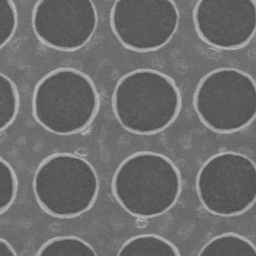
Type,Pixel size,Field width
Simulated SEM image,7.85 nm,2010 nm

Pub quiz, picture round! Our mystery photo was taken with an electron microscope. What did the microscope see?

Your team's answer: holes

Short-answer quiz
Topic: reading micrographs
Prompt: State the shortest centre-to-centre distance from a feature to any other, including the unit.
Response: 634 nanometers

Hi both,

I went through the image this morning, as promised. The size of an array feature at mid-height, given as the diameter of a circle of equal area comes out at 491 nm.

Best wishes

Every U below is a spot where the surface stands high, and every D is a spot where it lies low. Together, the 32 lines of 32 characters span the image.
DUUUUDDDDDDUUUDDDDDDDDUUUDDDDDDD
DDUUDDDDDDDDUUDDDDDDDDUUDDDDDDDD
DDUUDDDDDDDDUUDDDDDDDDUUDDDDDDDD
DDUUDDDDDDDDUUDDDDDDDDUUUDDDDDDD
DUUUUDDDDDDUUUUDDDDDDUUUUDDDDDDU
UUUUUUDDDDUUUUUUDDDDUUUUUUUDDDUU
UUUUUUUUUUUUUUUUUUUUUUUUUUUUUUUU
UUUUUUUUUUUUUUUUUUUUUUUUUUUUUUUU
UUUUUUUUUUUUUUUUUUUUUUUUUUUUUUUU
UUUUUUDDDDDUUUUUDDDDUUUUUUDDDDDU
DDUUUDDDDDDUUUUDDDDDDUUUUDDDDDDD
DDUUUDDDDDDDUUDDDDDDDDUUUDDDDDDD
DDUUDDDDDDDDUUDDDDDDDDUUDDDDDDDD
DDUUDDDDDDDDUUDDDDDDDDUUUDDDDDDD
DDUUUDDDDDDDUUUDDDDDDDUUUDDDDDDD
DUUUUDDDDDDUUUUDDDDDDUUUUUDDDDDU
UUUUUUUDDUUUUUUUUDDUUUUUUUUUUUUU
UUUUUUUUUUUUUUUUUUUUUUUUUUUUUUUU
UUUUUUUUUUUUUUUUUUUUUUUUUUUUUUUU
UUUUUUUDDUUUUUUUUDDDUUUUUUUUDDUU
DUUUUDDDDDDUUUUDDDDDDUUUUUDDDDDD
DUUUUDDDDDDDUUUDDDDDDDUUUDDDDDDD
DDUUDDDDDDDDUUDDDDDDDDUUUDDDDDDD
DDUUDDDDDDDDUUDDDDDDDDUUUDDDDDDD
DDUUUDDDDDDDUUUDDDDDDDUUUDDDDDDD
DUUUUDDDDDDUUUUDDDDDDUUUUUDDDDDU
UUUUUUDDDDUUUUUUDDDDUUUUUUUDDDUU
UUUUUUUUUUUUUUUUUUUUUUUUUUUUUUUU
UUUUUUUUUUUUUUUUUUUUUUUUUUUUUUUU
UUUUUUUUUUUUUUUUUUUUUUUUUUUUDUUU
DUUUUUDDDDDUUUUUDDDDDUUUUUDDDDDU
DDUUUDDDDDDDUUUDDDDDDDUUUDDDDDDD